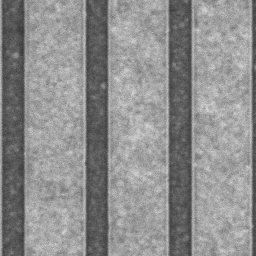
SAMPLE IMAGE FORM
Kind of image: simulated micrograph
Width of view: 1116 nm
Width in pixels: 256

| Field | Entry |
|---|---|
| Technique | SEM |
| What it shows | one or a few lines or trenches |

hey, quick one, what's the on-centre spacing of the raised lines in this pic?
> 364 nm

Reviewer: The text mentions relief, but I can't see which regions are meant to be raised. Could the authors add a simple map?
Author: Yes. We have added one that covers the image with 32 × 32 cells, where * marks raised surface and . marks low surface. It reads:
...********...*******...*******.
...********...*******...*******.
...********...*******...*******.
...********...*******...*******.
...********...*******...*******.
...********...*******...*******.
...********...*******...*******.
...********...*******...*******.
...********...*******...*******.
...********...*******...*******.
...********...*******...*******.
...********...*******...*******.
...********...*******...*******.
...********...*******...*******.
...********...*******...*******.
...********...*******...*******.
...********...*******...*******.
...********...*******...*******.
...********...*******...*******.
...********...*******...*******.
...********...*******...*******.
...********...*******...*******.
...********...*******...*******.
...********...*******...*******.
...********...*******...*******.
...********...*******...*******.
...********...*******...*******.
...********...*******...*******.
...********...*******...*******.
...********...*******...*******.
...********...*******...*******.
...********...*******...*******.